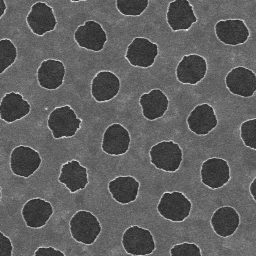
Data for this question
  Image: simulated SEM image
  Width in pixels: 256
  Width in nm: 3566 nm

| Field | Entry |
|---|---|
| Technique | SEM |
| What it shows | a regular array of holes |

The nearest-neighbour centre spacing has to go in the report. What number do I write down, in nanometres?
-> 702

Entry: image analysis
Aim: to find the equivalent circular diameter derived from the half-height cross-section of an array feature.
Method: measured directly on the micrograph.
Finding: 414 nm